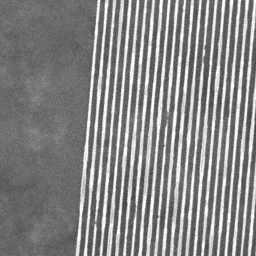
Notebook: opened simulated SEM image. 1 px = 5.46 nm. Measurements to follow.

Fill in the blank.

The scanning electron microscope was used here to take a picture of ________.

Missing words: parallel lines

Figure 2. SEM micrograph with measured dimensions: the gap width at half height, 31.9 nanometres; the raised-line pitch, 0.0425 um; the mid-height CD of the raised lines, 0.0136 micrometres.